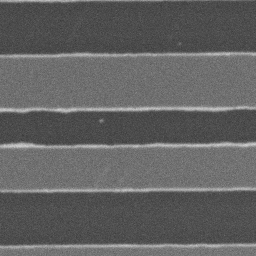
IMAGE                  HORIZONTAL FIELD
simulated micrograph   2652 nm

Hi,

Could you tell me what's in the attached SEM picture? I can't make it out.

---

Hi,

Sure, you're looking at lines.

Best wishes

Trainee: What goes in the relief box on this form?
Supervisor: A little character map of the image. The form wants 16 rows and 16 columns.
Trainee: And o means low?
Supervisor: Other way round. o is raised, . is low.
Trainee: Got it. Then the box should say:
................
................
................
...ooooooooooooo
oooooooooooooooo
oooooooooooooooo
oooooooooooooooo
................
................
oooooooooooooooo
oooooooooooooooo
oooooooooooooooo
................
................
................
oooooooooooooooo